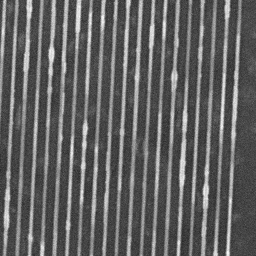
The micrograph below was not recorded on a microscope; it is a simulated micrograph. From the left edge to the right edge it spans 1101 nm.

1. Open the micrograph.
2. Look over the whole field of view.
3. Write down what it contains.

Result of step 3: parallel lines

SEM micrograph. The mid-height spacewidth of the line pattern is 0.0409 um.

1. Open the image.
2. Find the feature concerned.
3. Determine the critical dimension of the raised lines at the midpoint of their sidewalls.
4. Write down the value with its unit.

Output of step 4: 11.8 nm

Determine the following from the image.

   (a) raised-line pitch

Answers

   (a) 53.3 nanometers